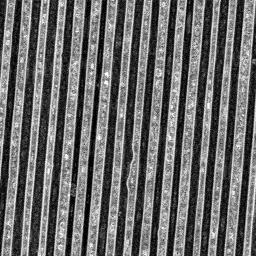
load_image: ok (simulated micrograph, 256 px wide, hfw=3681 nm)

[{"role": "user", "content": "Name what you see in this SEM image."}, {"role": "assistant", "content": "parallel lines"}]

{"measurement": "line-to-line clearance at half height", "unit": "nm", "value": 124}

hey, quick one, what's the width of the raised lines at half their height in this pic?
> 124 nm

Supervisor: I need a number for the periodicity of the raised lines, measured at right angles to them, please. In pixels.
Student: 17.1